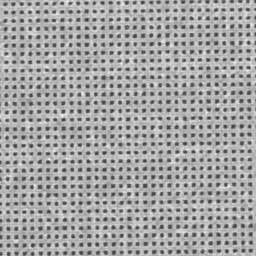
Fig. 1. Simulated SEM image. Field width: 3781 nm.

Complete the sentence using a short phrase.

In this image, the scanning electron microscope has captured a regular array of holes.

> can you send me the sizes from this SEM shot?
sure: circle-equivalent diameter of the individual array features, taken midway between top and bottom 74.5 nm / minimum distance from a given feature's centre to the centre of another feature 114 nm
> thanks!